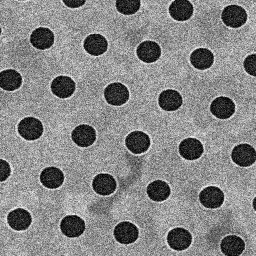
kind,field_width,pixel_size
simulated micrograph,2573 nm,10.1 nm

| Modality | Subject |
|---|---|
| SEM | a regular array of holes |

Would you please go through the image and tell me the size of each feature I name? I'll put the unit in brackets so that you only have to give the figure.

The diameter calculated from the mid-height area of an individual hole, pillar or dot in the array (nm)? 246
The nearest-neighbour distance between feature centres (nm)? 529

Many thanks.